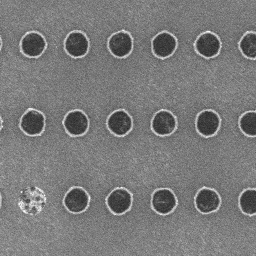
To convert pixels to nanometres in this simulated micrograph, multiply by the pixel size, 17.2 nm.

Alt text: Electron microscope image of a regular array of raised bodies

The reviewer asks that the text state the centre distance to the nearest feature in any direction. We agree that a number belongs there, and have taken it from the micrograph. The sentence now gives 745 nm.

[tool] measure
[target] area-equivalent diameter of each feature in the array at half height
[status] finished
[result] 436 nm